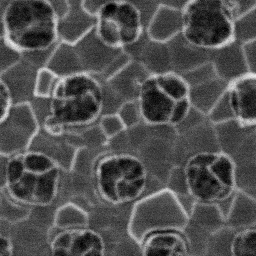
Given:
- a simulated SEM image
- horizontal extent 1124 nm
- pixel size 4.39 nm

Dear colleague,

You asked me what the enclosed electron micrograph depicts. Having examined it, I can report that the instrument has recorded raised bodies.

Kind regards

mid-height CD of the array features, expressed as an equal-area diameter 226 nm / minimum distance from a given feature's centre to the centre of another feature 331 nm